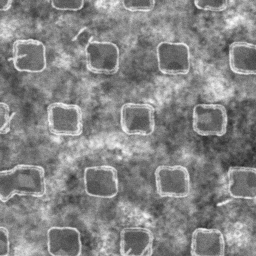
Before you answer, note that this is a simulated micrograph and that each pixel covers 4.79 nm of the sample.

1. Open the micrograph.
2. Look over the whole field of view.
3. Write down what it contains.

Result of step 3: a regular array of raised bodies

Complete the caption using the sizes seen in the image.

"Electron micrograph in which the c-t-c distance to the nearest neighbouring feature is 71 pixels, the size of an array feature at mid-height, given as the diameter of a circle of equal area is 165 nm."